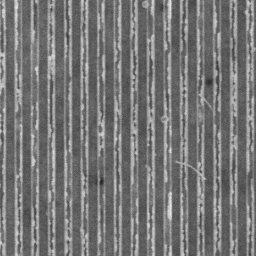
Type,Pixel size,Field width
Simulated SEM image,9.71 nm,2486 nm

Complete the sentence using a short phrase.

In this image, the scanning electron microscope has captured parallel lines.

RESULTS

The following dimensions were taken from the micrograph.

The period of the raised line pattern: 161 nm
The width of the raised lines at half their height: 70.4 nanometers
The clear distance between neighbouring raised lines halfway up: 94.6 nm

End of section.